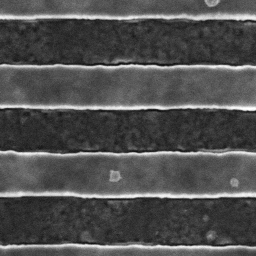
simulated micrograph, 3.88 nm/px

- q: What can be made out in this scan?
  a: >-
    lines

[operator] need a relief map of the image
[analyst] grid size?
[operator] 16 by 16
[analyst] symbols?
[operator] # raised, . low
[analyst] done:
################
................
................
................
################
################
################
................
................
#.........###.##
################
################
................
................
................
################